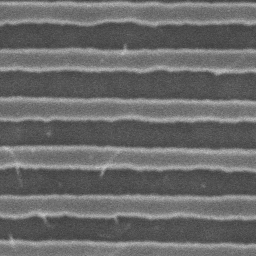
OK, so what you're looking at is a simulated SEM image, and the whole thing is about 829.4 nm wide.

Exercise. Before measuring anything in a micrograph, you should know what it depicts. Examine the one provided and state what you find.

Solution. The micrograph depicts lines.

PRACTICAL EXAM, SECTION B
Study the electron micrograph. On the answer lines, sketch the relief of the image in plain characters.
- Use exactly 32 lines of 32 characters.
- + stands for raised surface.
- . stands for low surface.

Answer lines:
++++++++++++++++++++++++++++++++
++++++++++++++++++++++++++++++++
++++++++++++++++++++++++++++++++
................................
................................
................................
++++++++++++++++++++++++++++++++
++++++++++++++++++++++++++++++++
++++++++++++++++++++++++++++++++
................................
................................
................................
++++++++++++++++++++.++.........
++++++++++++++++++++++++++++++++
++++++++++++++++++++++++++++++++
................................
................................
................................
+++++++++++++++.................
++++++++++++++++++++++++++++++++
++++++++++++++++++++++++++++++++
................................
................................
................................
++...+++++++++.+++++........+++.
++++++++++++++++++++++++++++++++
++++++++++++++++++++++++++++++++
................................
................................
................................
++++++++++++++++++++++......+...
++++++++++++++++++++++++++++++++